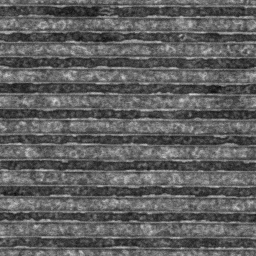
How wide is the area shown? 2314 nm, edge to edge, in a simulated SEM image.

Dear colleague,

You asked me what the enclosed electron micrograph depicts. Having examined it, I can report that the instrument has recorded parallel lines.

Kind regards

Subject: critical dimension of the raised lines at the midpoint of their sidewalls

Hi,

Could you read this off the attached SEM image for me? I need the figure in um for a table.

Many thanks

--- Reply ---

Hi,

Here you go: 0.103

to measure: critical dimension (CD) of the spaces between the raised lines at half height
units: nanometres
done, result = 127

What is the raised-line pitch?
232 nm